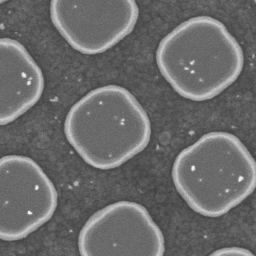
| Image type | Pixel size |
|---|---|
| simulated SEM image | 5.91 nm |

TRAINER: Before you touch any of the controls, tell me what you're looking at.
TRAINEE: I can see raised bodies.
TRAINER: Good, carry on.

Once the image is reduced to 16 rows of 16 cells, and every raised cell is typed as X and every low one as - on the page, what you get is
---XXXXX--------
----XXXX----XX--
----XXX---XXXXX-
XX--------XXXXX-
XX--------XXXXX-
XXX--------XXX--
XX---XXXX-------
X---XXXXX-------
----XXXXX----X--
-----XXX----XXX-
XX---------XXXXX
XXX--------XXXXX
XXX---------XXX-
XXX---XXX-------
XX---XXXXX------
-----XXXXX------